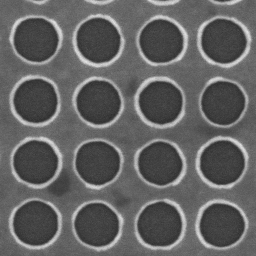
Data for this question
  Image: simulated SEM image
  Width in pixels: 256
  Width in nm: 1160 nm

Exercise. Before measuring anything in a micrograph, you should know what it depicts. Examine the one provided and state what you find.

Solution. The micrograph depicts a regular array of holes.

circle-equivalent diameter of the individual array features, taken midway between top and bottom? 210 nanometers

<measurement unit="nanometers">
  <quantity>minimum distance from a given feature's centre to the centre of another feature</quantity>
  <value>277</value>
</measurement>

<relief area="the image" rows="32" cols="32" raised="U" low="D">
UUUUUUUUUUUUUUUUUUUUUUUUUUUUUUUU
UUUUUUUUUUUUUUUUUUUUUUUUUUUUUUUU
UUUDDDUUUUUDDDUUUUUDDUUUUUUDDUUU
UUDDDDDUUUDDDDDUUUDDDDUUUDDDDDUU
UUDDDDDUUDDDDDDUUDDDDDDUUDDDDDDU
UUDDDDDUUUDDDDDUUDDDDDDUUDDDDDDU
UUDDDDDUUUDDDDDUUUDDDDDUUDDDDDDU
UUUDDDUUUUUDDDUUUUDDDDUUUUDDDDUU
UUUUUUUUUUUUUUUUUUUUUUUUUUUUUUUU
UUUUUUUUUUUUUUUUUUUUUUUUUUUUUUUU
UUDDDDUUUUUDDDUUUUDDDDUUUUDDDDUU
UUDDDDDUUUDDDDDUUDDDDDDUUDDDDDUU
UUDDDDDUUDDDDDDUUDDDDDDUUDDDDDDU
UUDDDDDUUUDDDDDUUDDDDDDUUDDDDDDU
UUDDDDDUUUDDDDDUUUDDDDUUUUDDDDUU
UUUUUUUUUUUDDUUUUUUDDUUUUUUDDUUU
UUUUUUUUUUUUUUUUUUUUUUUUUUUUUUUU
UUUUDUUUUUUUUUUUUUUUUUUUUUUDDUUU
UUDDDDDUUUDDDDUUUUDDDDUUUUDDDDUU
UUDDDDDUUDDDDDDUUDDDDDDUUDDDDDDU
UUDDDDDUUDDDDDDUUDDDDDDUUDDDDDDU
UUDDDDDUUUDDDDDUUDDDDDDUUDDDDDUU
UUUDDDUUUUDDDDUUUUDDDDUUUUDDDDUU
UUUUUUUUUUUUUUUUUUUUUUUUUUUUUUUU
UUUUUUUUUUUUUUUUUUUUUUUUUUUUUUUU
UUUDDDUUUUUDDUUUUUUDDDUUUUDDUUUU
UUDDDDDUUUDDDDUUUUDDDDUUUDDDDDUU
UUDDDDDUUDDDDDDUUDDDDDDUUDDDDDDU
UUDDDDDUUDDDDDDUUDDDDDDUUDDDDDDU
UUDDDDDUUUDDDDDUUDDDDDDUUDDDDDUU
UUUDDDUUUUUDDDUUUUDDDDUUUUDDDUUU
UUUUUUUUUUUUUUUUUUUUUUUUUUUUUUUU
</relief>